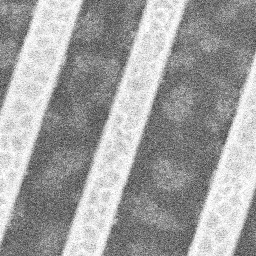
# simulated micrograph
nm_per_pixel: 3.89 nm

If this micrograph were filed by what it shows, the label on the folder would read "one or a few lines or trenches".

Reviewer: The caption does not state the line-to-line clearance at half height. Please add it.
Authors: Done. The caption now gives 273 nm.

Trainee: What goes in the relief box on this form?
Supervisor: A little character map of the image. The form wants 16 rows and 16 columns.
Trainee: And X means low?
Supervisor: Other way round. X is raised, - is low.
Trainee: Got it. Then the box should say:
--XXX----XX-----
--XX-----XX-----
--XX-----XX-----
-XXX----XX------
-XX-----XX------
-XX-----XX------
XXX----XX------X
XX-----XX------X
XX-----XX------X
XX----XX------XX
X-----XX------XX
X-----XX-----XXX
X----XX------XX-
-----XX------XX-
-----XX-----XXX-
----XX------XX--